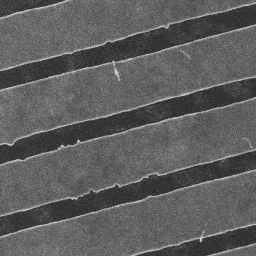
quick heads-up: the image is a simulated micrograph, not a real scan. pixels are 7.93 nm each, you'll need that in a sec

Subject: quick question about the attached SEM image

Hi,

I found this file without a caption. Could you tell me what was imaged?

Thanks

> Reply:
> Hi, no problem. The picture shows one or a few lines or trenches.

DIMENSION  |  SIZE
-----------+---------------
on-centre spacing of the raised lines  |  0.559 um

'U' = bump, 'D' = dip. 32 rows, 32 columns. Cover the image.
DDDDDDDUUUUUUUUUUUUUUUUUUUUUUUUU
DDUUUUUUUUUUUUUUUUUUUUUUUUUUDDDD
UUUUUUUUUUUUUUUUUUUUUUUDDDDDDDDD
UUUUUUUUUUUUUUUUUUUUDDDDDDDDDDUU
UUUUUUUUUUUUUUUUDDDDDDDDDDDUUUUU
UUUUUUUUUUUUUDDDDDDDDDDUUUUUUUUU
UUUUUUUUUDDDDDDDDDDDUUUUUUUUUUUU
UUUUUDDDDDDDDDDDUUUUUUUUUUUUUUUU
UDDDDDDDDDDUUUUUUUUUUUUUUUUUUUUU
DDDDDDDUUUUUUUUUUUUUUUUUUUUUUUUU
DDDUUUUUUUUUUUUUUUUUUUUUUUUUDDDD
UUUUUUUUUUUUUUUUUUUUUUUUDDDDDDDD
UUUUUUUUUUUUUUUUUUUUDDDDDDDDDDDU
UUUUUUUUUUUUUUUUUDDDDDDDDDDUUUUU
UUUUUUUUUUUUUUDDDDDDDDDUUUUUUUUU
UUUUUUUUUDDDDDDDDDDUUUUUUUUUUUUU
UUUUUDDDDDDDDDDUUUUUUUUUUUUUUUUU
UUDDDDDDDDDUUUUUUUUUUUUUUUUUUUUU
DDDDDDDUUUUUUUUUUUUUUUUUUUUUUUUU
DDDDUUUUUUUUUUUUUUUUUUUUUUUUUDDD
UUUUUUUUUUUUUUUUUUUUUUUUUDDDDDDD
UUUUUUUUUUUUUUUUUUUUUUDDDDDDDDDU
UUUUUUUUUUUUUUUUUUDDDDDDDDDUUUUU
UUUUUUUUUUUUUUDDDDDDDDDUUUUUUUUU
UUUUUUUUUUDDDDDDDDDUUUUUUUUUUUUU
UUUUUUDDDDDDDDDUUUUUUUUUUUUUUUUU
UUDDDDDDDDDDUUUUUUUUUUUUUUUUUUUU
DDDDDDDDUUUUUUUUUUUUUUUUUUUUUUUU
DDDDUUUUUUUUUUUUUUUUUUUUUUUUUUDD
UUUUUUUUUUUUUUUUUUUUUUUUUUDDDDDD
UUUUUUUUUUUUUUUUUUUUUUUDDDDDDDDD
UUUUUUUUUUUUUUUUUUDDDDUDDDDDUUUU